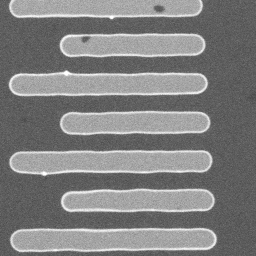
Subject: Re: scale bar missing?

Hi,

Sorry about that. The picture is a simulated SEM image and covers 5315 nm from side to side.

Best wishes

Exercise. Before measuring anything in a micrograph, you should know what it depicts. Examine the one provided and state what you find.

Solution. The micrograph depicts groups of lines, slits or small figures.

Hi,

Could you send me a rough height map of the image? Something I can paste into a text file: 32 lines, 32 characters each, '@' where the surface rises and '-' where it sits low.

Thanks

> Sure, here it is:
-@@@@@@@@@@@@@@@@@@@@@@@@-------
-@@@@@@@@@@@@@@@@@@@@@@@@-------
--------------------------------
--------------------------------
---------@@@@@@@@@@@@@@@@-------
--------@@@@@@@@@@@@@@@@@@------
--------@@@@@@@@@@@@@@@@@-------
--------------------------------
--------------------------------
--@@@@@@@@@@@@@@@@@@@@@@@-------
-@@@@@@@@@@@@@@@@@@@@@@@@@------
--@@@@@@@@@@@@@@@@@@@@@@@-------
--------------------------------
--------------------------------
--------@@@@@@@@@@@@@@@@@@------
--------@@@@@@@@@@@@@@@@@@------
--------@@@@@@@@@@@@@@@@@-------
--------------------------------
--------------------------------
--@@@@@@@@@@@@@@@@@@@@@@@@------
-@@@@@@@@@@@@@@@@@@@@@@@@@------
--@@@@@@--------@@@-------------
--------------------------------
--------------------------------
--------@@@@@@@@@@@@@@@@@@@-----
--------@@@@@@@@@@@@@@@@@@@-----
--------------------------------
--------------------------------
--------------------------------
--@@@@@@@@@@@@@@@@@@@@@@@@@-----
-@@@@@@@@@@@@@@@@@@@@@@@@@@-----
--------------------------------